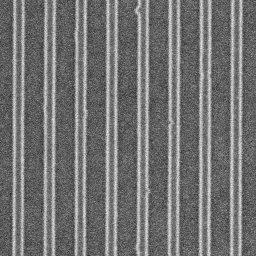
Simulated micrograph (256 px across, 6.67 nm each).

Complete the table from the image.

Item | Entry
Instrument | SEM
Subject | parallel lines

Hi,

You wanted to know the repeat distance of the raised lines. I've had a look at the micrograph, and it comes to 207 nm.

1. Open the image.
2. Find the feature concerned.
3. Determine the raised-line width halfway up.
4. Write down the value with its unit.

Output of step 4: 55 nanometres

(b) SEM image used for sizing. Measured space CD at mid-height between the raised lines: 148 nm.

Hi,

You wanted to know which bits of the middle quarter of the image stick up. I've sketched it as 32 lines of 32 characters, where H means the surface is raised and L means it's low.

LLLHHLLLLLLHHLLLLLLHHLLLLLLHHLLL
LLLHHLLLLLLHHLLLLLLHHLLLLLLHHLLL
LLLHHLLLLLLHHLLLLLLHHLLLLLLHHLLL
LLLHHLLLLLLHHLLLLLLHHLLLLLLHHLLL
LLLHHLLLLLLHHLLLLLLHHLLLLLLHHLLL
LLLHHLLLLLLHHLLLLLLHHLLLLLLHHLLL
LLLHHLLLLLLHHLLLLLLHHLLLLLLHHLLL
LLLHHLLLLLLHHLLLLLLHHLLLLLLHHLLL
LLLHHLLLLLLHHLLLLLLHHLLLLLLHHLLL
LLLHHLLLLLLHHLLLLLLHHLLLLLLHHLLL
LLLHHLLLLLLHHLLLLLLHHLLLLLLHHLLL
LLLHHLLLLLLHHLLLLLLHHLLLLLLHHLLL
LLLHHLLLLLLHHLLLLLLHHLLLLLLHHLLL
LLLHHLLLLLLHHLLLLLLHHLLLLLLHHLLL
LLLHHLLLLLLHHLLLLLLHHLLLLLLHHLLL
LLLHHLLLLLLHHLLLLLLHHLLLLLLHHLLL
LLLHHLLLLLLHHLLLLLLHHLLLLLLHHLLL
LLLHHLLLLLLHHLLLLLLHHLLLLLLHHLLL
LLLHHLLLLLLHHLLLLLLHHLLLLLLHHLLL
LLLHHLLLLLLHHLLLLLLHHLLLLLLHLLLL
LLLHHLLLLLLHHLLLLLLHHLLLLLLHLLLL
LLLHHLLLLLLHHLLLLLLHHLLLLLLHHLLL
LLLHHLLLLLLHHLLLLLLHHLLLLLLHHLLL
LLLHHLLLLLLHHLLLLLLHHLLLLLHHHLLL
LLLHHLLLLLLHHLLLLLLHHLLLLLHHHLLL
LLLHHLLLLLLHHLLLLLLHHLLLLLHHHLLL
LLLHHLLLLLLHHLLLLLLHHLLLLLHHHLLL
LLLHHLLLLLLHHLLLLLLHHLLLLLHHLLLL
LLLHHLLLLLLHHLLLLLLHHLLLLLHHLLLL
LLLHHLLLLLLHHLLLLLLHHLLLLLHHLLLL
LLLHHLLLLLLHHLLLLLLHHLLLLLHHLLLL
LLLHHLLLLLLHHLLLLLLHHLLLLLHHLLLL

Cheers